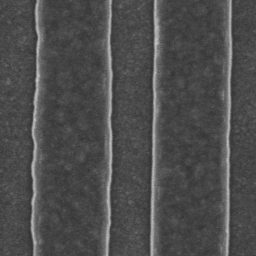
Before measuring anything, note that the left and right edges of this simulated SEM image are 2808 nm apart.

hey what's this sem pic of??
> one or a few lines or trenches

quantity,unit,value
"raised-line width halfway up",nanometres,832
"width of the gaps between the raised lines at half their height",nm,472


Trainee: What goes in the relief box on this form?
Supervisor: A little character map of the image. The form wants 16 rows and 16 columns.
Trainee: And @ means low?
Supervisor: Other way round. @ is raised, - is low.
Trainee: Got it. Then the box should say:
--@@@@@---@@@@--
--@@@@@---@@@@--
--@@@@@---@@@@--
--@@@@@---@@@@--
--@@@@@---@@@@--
--@@@@@---@@@@--
--@@@@@---@@@@--
--@@@@@---@@@@--
--@@@@@---@@@@--
--@@@@@---@@@@--
--@@@@@---@@@@--
--@@@@@---@@@@--
--@@@@@---@@@@--
--@@@@@---@@@@--
--@@@@@--@@@@@--
--@@@@@--@@@@@--